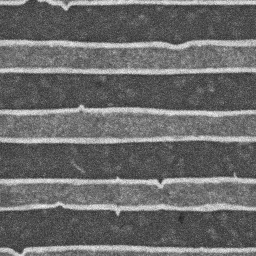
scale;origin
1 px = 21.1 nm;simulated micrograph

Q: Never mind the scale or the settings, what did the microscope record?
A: one or a few lines or trenches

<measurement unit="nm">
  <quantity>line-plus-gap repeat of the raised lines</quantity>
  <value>1440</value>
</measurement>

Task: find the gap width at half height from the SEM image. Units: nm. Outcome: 862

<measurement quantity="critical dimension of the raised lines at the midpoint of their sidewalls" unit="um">0.577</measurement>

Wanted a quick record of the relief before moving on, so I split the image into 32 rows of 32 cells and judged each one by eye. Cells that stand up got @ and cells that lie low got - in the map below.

--------@-----------------------
--------------------------------
--------------------------------
--------------------------------
--------------------------------
@@@@@@@@@---------------@@@@@@@@
@@@@@@@@@@@@@@@@@@@@@@@@@@@@@@@@
@@@@@@@@@@@@@@@@@@@@@@@@@@@@@@@@
@@@@@@@@@@@@@@@@@@@@@@@@@@@@@@@@
--------------------------------
--------------------------------
--------------------------------
--------------------------------
--------------------------------
@@@@@@@@@@@@@@@@@@@@@@@@@@@@@@@@
@@@@@@@@@@@@@@@@@@@@@@@@@@@@@@@@
@@@@@@@@@@@@@@@@@@@@@@@@@@@@@@@@
-@@@@@@--@@@@@@@----------------
--------------------------------
--------------------------------
--------------------------------
--------------------------------
---------------------------@@@--
@@@@@@@@@@@@@@@@@@@@@@@@@@@@@@@@
@@@@@@@@@@@@@@@@@@@@@@@@@@@@@@@@
@@@@@@@@@@@@@@@@@@@@@@@@@@@@@@@@
--------------------------------
--------------------------------
--------------------------------
--------------------------------
--------------------------------
@@-@@@@@@@@@@@@@@@@@@@@@@@@@@@@@